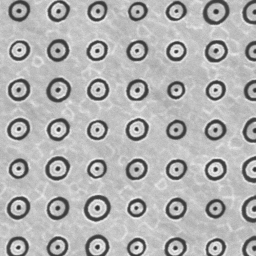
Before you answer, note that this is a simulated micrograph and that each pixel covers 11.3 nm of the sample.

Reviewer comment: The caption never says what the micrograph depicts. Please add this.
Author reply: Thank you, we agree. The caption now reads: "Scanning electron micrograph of a regular array of ring-shaped grooves with a dot in the middle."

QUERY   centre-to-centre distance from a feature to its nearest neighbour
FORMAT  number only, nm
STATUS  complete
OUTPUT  440